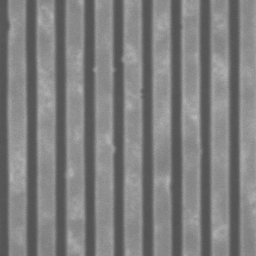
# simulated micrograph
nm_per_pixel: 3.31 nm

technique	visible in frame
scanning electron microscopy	parallel lines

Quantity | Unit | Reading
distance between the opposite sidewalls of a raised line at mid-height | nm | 60.9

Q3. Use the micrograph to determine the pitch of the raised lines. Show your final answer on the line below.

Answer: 95.8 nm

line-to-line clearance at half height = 0.0364 microns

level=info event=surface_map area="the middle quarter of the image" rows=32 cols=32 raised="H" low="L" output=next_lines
LHHHHLLLHHHHLLLHHHHLLLHHHHHLLLHH
LHHHHLLLHHHHLLLHHHHLLLHHHHHLLLHH
LHHHHLLLHHHHLLLHHHHLLLHHHHHLLLHH
LHHHHLLLHHHHLLLHHHHLLLHHHHHLLLHH
LHHHHLLLHHHHLLLHHHHLLLHHHHHLLLHH
LHHHHLLLHHHHLLLHHHHLLLHHHHHLLLHH
LHHHHLLLHHHHLLLHHHHLLLHHHHHLLLHH
LHHHHLLLHHHHLLLHHHHLLLHHHHHLLLHH
LHHHHLLLHHHHLLLHHHHLLLHHHHHLLLHH
LHHHHLLLHHHHLLLHHHHLLLHHHHHLLLHH
LHHHHLLLHHHHLLLHHHHLLLHHHHHLLLHH
LHHHHLLLHHHHLLLHHHHLLLHHHHHLLLHH
LHHHHLLLHHHHLLLHHHHLLLHHHHHLLLHH
LHHHHLLLHHHHLLLHHHHLLLHHHHHLLLHH
LHHHHLLLHHHHLLLHHHHLLLHHHHHLLLHH
LHHHHLLLHHHHLLLHHHHLLLHHHHHLLLHH
LHHHHLLLHHHHLLLHHHHLLLHHHHHLLLHH
LHHHHLLLHHHHLLLHHHHLLLHHHHHLLLHH
LHHHHLLLHHHHLLLHHHHLLLHHHHHLLLHH
LHHHHLLLHHHHLLLHHHHLLLHHHHHLLLHH
LHHHHLLLHHHHLLLHHHHLLLHHHHHLLLHH
LHHHHLLLHHHHHLLHHHHLLLHHHHHLLLHH
LHHHHLLLHHHHLLLHHHHHLLLHHHHLLLHH
LHHHHLLLHHHHLLLHHHHHLLLHHHHLLLHH
LHHHHLLLHHHHLLLHHHHHLLLHHHHLLLHH
LHHHHLLLHHHHLLLHHHHHLLLHHHHLLLHH
LHHHHLLLHHHHLLLHHHHLLLLHHHHLLLHH
HHHHHLLLHHHHLLLHHHHLLLLHHHHLLLHH
LHHHHLLLHHHHLLLHHHHLLLLHHHHLLLHH
LHHHHLLLHHHHLLLHHHHLLLLHHHHLLLHH
LHHHHLLLHHHHLLLHHHHLLLLHHHHLLLHH
LHHHHLLLHHHHLLLHHHHLLLLHHHLLLLHH